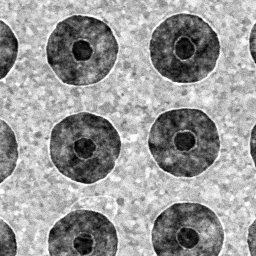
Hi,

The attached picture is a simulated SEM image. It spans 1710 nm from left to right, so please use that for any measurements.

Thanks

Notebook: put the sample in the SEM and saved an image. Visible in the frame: ring-shaped grooves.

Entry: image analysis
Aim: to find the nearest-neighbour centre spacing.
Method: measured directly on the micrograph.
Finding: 637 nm